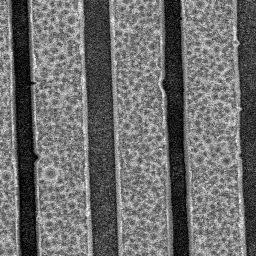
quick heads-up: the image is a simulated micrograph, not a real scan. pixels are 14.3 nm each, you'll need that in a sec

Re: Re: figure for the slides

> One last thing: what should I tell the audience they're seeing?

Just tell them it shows one or a few lines or trenches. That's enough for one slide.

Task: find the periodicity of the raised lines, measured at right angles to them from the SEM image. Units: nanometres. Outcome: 1090